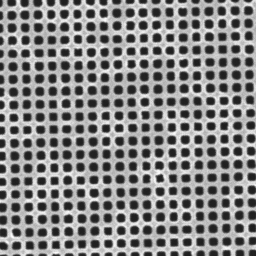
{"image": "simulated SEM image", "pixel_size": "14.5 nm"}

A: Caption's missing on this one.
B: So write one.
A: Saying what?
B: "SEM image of a regular array of holes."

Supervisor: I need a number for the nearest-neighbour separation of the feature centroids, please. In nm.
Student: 182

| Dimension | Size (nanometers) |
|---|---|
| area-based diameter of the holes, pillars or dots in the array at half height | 147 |